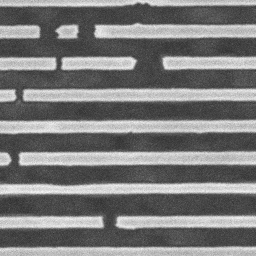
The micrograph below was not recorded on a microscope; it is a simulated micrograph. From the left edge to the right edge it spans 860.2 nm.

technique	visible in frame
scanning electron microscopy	parallel lines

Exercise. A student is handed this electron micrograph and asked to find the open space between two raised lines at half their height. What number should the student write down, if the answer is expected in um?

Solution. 0.0689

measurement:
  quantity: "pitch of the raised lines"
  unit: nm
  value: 107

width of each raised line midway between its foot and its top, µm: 0.0374